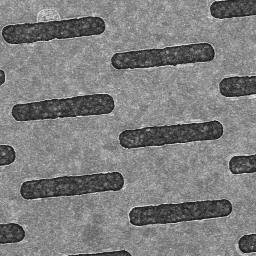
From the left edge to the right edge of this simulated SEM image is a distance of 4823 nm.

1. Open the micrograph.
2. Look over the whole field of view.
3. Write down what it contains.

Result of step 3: holes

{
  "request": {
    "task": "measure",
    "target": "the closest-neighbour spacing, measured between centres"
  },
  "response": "1.47 um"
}